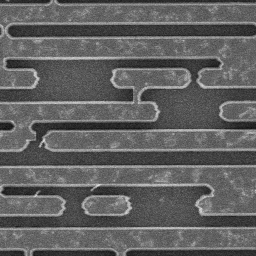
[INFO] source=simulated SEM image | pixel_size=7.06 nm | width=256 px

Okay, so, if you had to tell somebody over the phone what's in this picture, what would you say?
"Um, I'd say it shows parallel lines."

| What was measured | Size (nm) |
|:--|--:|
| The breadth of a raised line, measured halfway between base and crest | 139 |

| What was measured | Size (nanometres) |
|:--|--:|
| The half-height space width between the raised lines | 94.4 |